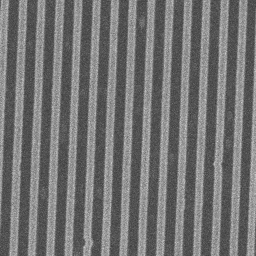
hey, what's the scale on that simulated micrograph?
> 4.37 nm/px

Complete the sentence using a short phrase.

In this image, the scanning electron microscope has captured parallel lines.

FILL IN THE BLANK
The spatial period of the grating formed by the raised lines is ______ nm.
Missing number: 80.1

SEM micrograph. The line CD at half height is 32.8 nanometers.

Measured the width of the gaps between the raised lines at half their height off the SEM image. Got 11.4 px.